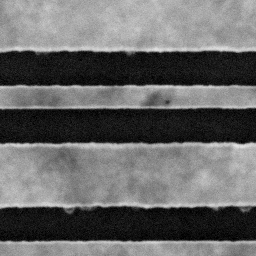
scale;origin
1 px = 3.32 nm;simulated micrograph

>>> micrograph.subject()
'lines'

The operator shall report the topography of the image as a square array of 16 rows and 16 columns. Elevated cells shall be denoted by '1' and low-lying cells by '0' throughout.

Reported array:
1111111111111111
1111111111111111
1111111111111111
0000000000000000
0000000000000000
1111111111111111
1111111111111111
0000000000000000
0000000000000000
1111111111111111
1111111111111111
1111111111111111
1111111111111111
0000000000000000
0000000000000000
1111111111111111